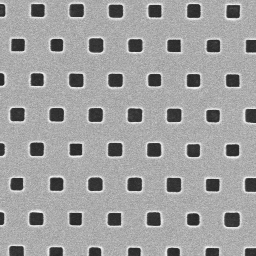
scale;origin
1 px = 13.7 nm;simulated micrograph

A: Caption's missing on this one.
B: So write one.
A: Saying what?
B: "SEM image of a regular array of holes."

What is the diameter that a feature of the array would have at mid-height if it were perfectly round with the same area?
212 nm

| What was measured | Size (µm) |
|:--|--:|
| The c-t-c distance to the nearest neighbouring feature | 0.53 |